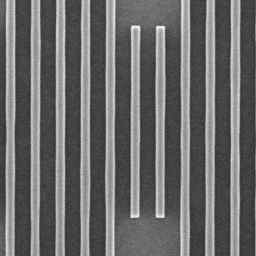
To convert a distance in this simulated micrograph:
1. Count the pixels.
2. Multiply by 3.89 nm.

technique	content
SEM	groups of lines, slits or small figures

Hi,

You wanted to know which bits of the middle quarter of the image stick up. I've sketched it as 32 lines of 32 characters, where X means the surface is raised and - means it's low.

----XX-----XX----XX----XX----XX-
----XX-----XX----XX----XX----XX-
----XX-----XX----XX----XX----XX-
----XX-----XX----XX----XX----XX-
----XX-----XX----XX----XX----XX-
----XX-----XX----XX----XX----XX-
----XX-----XX----XX----XX----XX-
----XX-----XX----XX----XX----XX-
----XX-----XX----XX----XX----XX-
----XX-----XX----XX----XX----XX-
----XX-----XX----XX----XX----XX-
----XX-----XX----XX----XX----XX-
----XX-----XX----XX----XX----XX-
----XX-----XX----XX----XX----XX-
----XX-----XX----XX----XX----XX-
----XX-----XX----XX----XX----XX-
----XX-----XX----XX----XX----XX-
----XX-----XX----XX----XX----XX-
----XX-----XX----XX----XX----XX-
----XX-----XX----XX----XX----XX-
----XX-----XX----XX----XX----XX-
----XX-----XX----XX----XX----XX-
----XX-----XX----XX----XX----XX-
----XX-----XX----XX----XX----XX-
----XX-----XX----XX----XX----XX-
----XX-----XX----XX----XX----XX-
----XX-----XX----XX----XX----XX-
----XX-----XX----XX----XX----XX-
----XX-----XX----XX----XX----XX-
----XX-----XX----XX----XX----XX-
----XX-----XX----XX----XX----XX-
----XX-----XX----XX----XX----XX-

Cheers